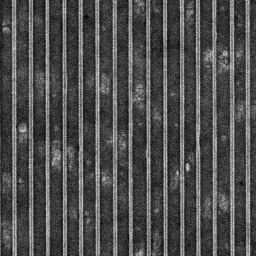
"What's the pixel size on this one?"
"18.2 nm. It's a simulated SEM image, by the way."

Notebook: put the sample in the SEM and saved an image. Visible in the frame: parallel lines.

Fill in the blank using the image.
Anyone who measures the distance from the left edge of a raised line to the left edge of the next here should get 304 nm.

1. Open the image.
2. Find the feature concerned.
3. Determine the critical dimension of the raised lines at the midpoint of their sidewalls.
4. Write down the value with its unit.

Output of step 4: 52.5 nm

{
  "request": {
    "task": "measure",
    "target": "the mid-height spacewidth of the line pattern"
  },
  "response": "249 nm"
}